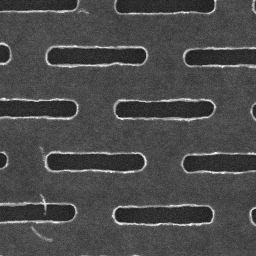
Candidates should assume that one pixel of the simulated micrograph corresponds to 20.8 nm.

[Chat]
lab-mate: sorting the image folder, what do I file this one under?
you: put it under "holes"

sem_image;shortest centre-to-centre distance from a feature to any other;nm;1810